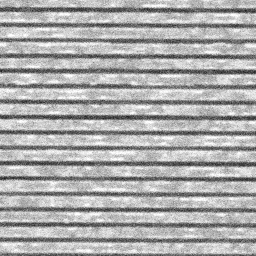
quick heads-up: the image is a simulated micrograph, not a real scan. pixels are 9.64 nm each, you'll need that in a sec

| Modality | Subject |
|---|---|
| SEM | parallel lines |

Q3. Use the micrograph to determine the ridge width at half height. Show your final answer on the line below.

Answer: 97.6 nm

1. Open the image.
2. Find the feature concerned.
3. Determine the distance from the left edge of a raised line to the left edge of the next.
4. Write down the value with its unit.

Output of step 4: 148 nm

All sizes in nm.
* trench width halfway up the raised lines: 48.2